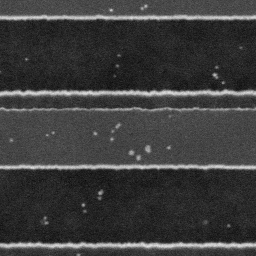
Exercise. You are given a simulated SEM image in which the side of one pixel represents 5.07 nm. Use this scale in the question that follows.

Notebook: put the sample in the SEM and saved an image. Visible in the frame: lines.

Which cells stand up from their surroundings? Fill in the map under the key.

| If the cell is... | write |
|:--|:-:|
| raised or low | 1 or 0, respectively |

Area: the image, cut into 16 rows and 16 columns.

1111111111111111
0000000000000000
0000000000000000
0000000000000000
0000000000000000
0000000000000000
1111111111111111
1111111111111111
1111111111111111
1111111111111111
0000000000000000
0000000000000000
0000000000000000
0000000000000000
0000000000000000
1111111111111111